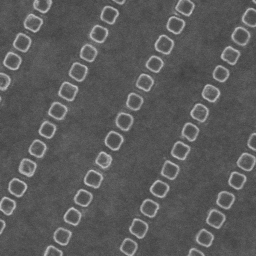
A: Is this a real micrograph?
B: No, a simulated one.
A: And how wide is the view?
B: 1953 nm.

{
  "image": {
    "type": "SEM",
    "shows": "a regular array of raised bodies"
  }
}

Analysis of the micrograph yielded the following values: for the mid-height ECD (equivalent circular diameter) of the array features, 128 nm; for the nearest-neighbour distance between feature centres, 164 nm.